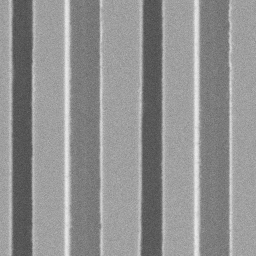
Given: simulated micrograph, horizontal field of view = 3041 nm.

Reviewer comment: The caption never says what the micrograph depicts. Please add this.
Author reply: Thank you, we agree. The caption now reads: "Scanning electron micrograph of lines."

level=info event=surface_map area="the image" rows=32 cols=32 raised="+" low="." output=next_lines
+...++++.....+++++..+++++....+++
+...++++.....+++++..+++++....+++
+...++++.....+++++..+++++....+++
+...++++.....+++++..+++++....+++
+...++++.....+++++..+++++....+++
+...++++.....+++++..+++++....+++
+...++++.....+++++..++++.....+++
+...++++.....+++++..+++++....+++
+...++++.....+++++..+++++....+++
+...++++.....+++++..+++++....+++
+...++++.....+++++..+++++....+++
+...++++.....+++++..+++++....+++
+...++++.....+++++..+++++....+++
+...++++.....+++++..+++++....+++
+...++++.....++++...+++++....+++
+...++++.....++++...+++++....+++
+...++++.....++++...+++++....+++
+...++++.....++++...+++++....+++
+...++++.....++++...+++++....+++
+...++++.....++++...+++++....+++
+...++++.....++++...+++++....+++
+...++++.....++++...+++++....+++
+...++++.....++++...+++++....+++
+...++++.....++++...+++++....+++
+...++++.....++++...++++.....+++
+...++++.....++++...++++.....+++
+...++++.....++++...+++++....+++
+...++++.....++++...+++++....+++
+...++++.....++++...+++++....+++
+...++++.....++++...+++++....+++
+...++++.....++++...+++++....+++
+...++++.....++++...+++++....+++